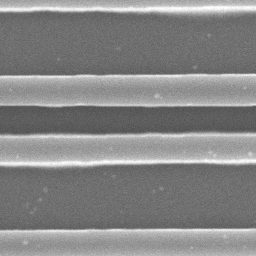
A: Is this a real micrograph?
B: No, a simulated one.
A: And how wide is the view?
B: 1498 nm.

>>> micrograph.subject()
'lines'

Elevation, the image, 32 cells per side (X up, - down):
XXXXXXXXXXXXXXXXXXXXXXXXXXXXXXXX
--------------------------------
--------------------------------
--------------------------------
--------------------------------
--------------------------------
--------------------------------
--------------------------------
--------------------------------
------------------X-XXXXXXXXXXXX
XXXXXXXXXXXXXXXXXXXXXXXXXXXXXXXX
XXXXXXXXXXXXXXXXXXXXXXXXXXXXXXXX
XXXXXXXXXXXXXXXXXXXXXXXXXXXXXXXX
--------------------------------
--------------------------------
--------------------------------
--------------------------------
XXXXXXXXXXXXXXXXXXXXXXXXXXXXXXXX
XXXXXXXXXXXXXXXXXXXXXXXXXXXXXXXX
XXXXXXXXXXXXXXXXXXXXXXXXXXXXXXXX
--------------------------------
--------------------------------
--------------------------------
--------------------------------
--------------------------------
--------------------------------
--------------------------------
--------------------------------
--------------------------------
XXXXXXXXXXXXXXXXXXXXXXXXXXXXXXXX
XXXXXXXXXXXXXXXXXXXXXXXXXXXXXXXX
XXXXXXXXXXXXXXXXXXXXXXXXXXXXXXXX